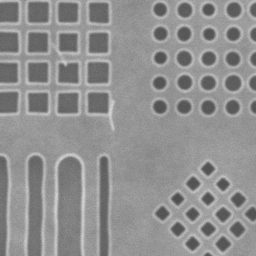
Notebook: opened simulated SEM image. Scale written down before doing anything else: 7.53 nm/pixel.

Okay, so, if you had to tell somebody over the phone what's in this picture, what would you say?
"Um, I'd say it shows groups of lines, slits or small figures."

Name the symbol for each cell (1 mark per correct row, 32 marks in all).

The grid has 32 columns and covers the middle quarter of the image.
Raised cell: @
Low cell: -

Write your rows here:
----@@-----@@@@@@@@@@@@@@@@@@@-@
----@@-----@@@@@@@@@@@@@@@@@@@@@
----@@-----@@@@@@@@@@@@@@@@@@@@@
----@@-----@@@@@@@@@@@@--@@@@---
----@@-----@@@@@@@@@@@----@@----
@@@@@@@@@@@@@@@@@@@@@@---@@@----
@@@@@@@@@@@@@@@@@@@@@@@@@@@@@@-@
----@@-----@@@@@@@@@@@@@@@@@@@@@
----@@-----@@@@@@@@@@@@@@@@@@@@@
----@@-----@@@@@@@@@@@@--@@@@--@
----@@-----@@@@@@@@@@@----@@----
----@@-----@@@@@@@@@@@----@@----
---@@@-----@@@@@@@@@@@@@@@@@@@@@
@@@@@@@@@@@@@@@@@@@@@@@@@@@@@@@@
@@@@@@@@@@@@@@@@@@@@@@@@@@@@@@@@
@@@@@@@@@@@@@@@@@@@@@@@@@@@@@@@@
@@@@@@@@@@@@@@@@@@@@@@@@@@@@@@@@
@@@@@@@@@@@@@@@@@@@@@@@@@@@@@@@@
@@@@@@@@@@@@@@@@@@@@@@@@@@@@@@@@
@@@@@@@@@@@@@@@@@@@@@@@@@@@@@@@@
@@@@@@@@@@@@@@@@@@@@@@@@@@@@@@@@
@@@@@@@@@@@@@@@@@@@@@@@@@@@@@@@@
@@@@@@@@@@@@@@@@@@@@@@@@@@@@@@@@
----@@@@@--@@@@@@@@@@@@@@@@@@@@@
----@@@@@--@@@@@@@@@@@@@@@@@@@@@
-----@@@@--@@@@@@@@@@@@@@@@@@@@@
-----@@@@--@@@@@@@@@@@@@@@@@@@@@
-----@@@@--@@@@@@@@@@@@@@@@@@@@@
-----@@@@--@@@@@@@@@@@@@@@@@@@@-
-----@@@@--@@@@@@@@@@@@@@@@@@@@-
-----@@@@--@@@@@@@@@@@@@@@@@@@@-
-----@@@@--@@@@@@@@@@@@@@@@@@@@@